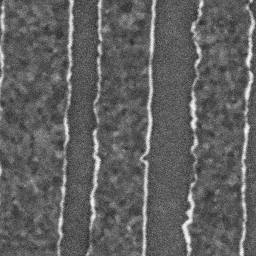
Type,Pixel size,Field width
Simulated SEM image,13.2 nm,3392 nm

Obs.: one or a few lines or trenches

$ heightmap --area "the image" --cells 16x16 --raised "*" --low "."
****..****...***
****..****..****
****..***...****
****..***...****
****..***...****
****..***...****
****..***...***.
****..***...***.
****..***...***.
****..***...***.
****..***...***.
****..***...***.
****..***...***.
****..***...***.
****..***...***.
****..***...***.